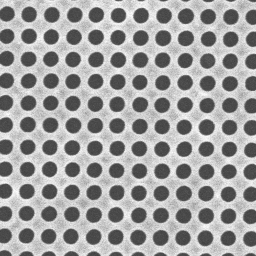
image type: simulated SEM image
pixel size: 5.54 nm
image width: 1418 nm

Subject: a regular array of holes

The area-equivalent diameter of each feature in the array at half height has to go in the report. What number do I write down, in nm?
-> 85.5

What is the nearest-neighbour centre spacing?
0.122 µm